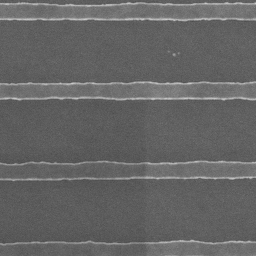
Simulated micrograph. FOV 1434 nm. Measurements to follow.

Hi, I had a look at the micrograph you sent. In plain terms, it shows lines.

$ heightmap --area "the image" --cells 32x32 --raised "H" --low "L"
HHHHHHLLLLLLLLLHHHHHHHLLHHHHHHHH
HHHHHHHHHHHHHHHHHHHHHHHHHHHHHHHH
LLLLLLLLLLLLLLLLLLLLLLHHLLLLLLLL
LLLLLLLLLLLLLLLLLLLLLLLLLLLLLLLL
LLLLLLLLLLLLLLLLLLLLLLLLLLLLLLLL
LLLLLLLLLLLLLLLLLLLLLLLLLLLLLLLL
LLLLLLLLLLLLLLLLLLLLLLLLLLLLLLLL
LLLLLLLLLLLLLLLLLLLLLLLLLLLLLLLL
LLLLLLLLLLLLLLLLLLLLLLLLLLLLLLLL
LLLLLLLLLLLLLLLLLLLLLLLLLLLLLLLL
HHHHHHHHHHHHHHHHHHHHHHHHHHHHHHHH
HHHHHHHHHHHHHHHHHHHHHHHHHHHHHHHH
LLLLLLLLLLLLLLLLLLLLLLLLLLLLLLLL
LLLLLLLLLLLLLLLLLLLLLLLLLLLLLLLL
LLLLLLLLLLLLLLLLLLLLLLLLLLLLLLLL
LLLLLLLLLLLLLLLLLLLLLLLLLLLLLLLL
LLLLLLLLLLLLLLLLLLLLLLLLLLLLLLLL
LLLLLLLLLLLLLLLLLLLLLLLLLLLLLLLL
LLLLLLLLLLLLLLLLLLLLLLLLLLLLLLLL
LLLLLLLLLLLLLLLLLLLLLLLLLLLLLLLL
HHHHHHHHHHHHHHHHHHHHHHHHHHHHHHHH
HHHHHHHHHHHHHHHHHHHHHHHHHHHHHHHH
LLLLLLLLLLLLLLLLLLLLLLLLLLLLLLLL
LLLLLLLLLLLLLLLLLLLLLLLLLLLLLLLL
LLLLLLLLLLLLLLLLLLLLLLLLLLLLLLLL
LLLLLLLLLLLLLLLLLLLLLLLLLLLLLLLL
LLLLLLLLLLLLLLLLLLLLLLLLLLLLLLLL
LLLLLLLLLLLLLLLLLLLLLLLLLLLLLLLL
LLLLLLLLLLLLLLLLLLLLLLLLLLLLLLLL
LLLLLLLLLLLLLLLLLLLLLLLLLLLLLLLL
HHHHHHHHHHHHHHHHHHHHHHHHHHHHHHHH
HHHHHHHHHHHHHHHHHHHHHHHHHHHHHHHH